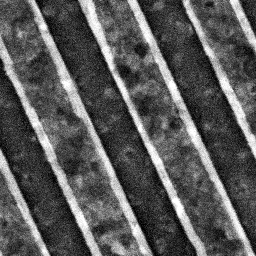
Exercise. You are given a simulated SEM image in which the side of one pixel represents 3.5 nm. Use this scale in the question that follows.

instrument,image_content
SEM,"one or a few lines or trenches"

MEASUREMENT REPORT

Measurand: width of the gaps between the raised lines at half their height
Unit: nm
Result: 156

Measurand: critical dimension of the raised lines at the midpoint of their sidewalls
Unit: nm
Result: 168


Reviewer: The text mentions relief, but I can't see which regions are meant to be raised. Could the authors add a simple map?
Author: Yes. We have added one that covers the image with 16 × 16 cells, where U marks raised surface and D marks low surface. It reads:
UUDDDUUUUDDDUUUD
UUUDDDUUUDDDUUUD
UUUDDDUUUUDDDUUU
UUUUDDDUUUDDDUUU
DUUUDDDUUUDDDDUU
DUUUDDDDUUUDDDUU
DDUUUDDDUUUDDDDU
DDUUUDDDDUUUDDDU
DDDUUUDDDUUUDDDD
DDDUUUDDDDUUUDDD
DDDUUUUDDDUUUDDD
UDDDUUUDDDUUUUDD
UDDDUUUUDDDUUUDD
UUDDDUUUDDDUUUUD
UUDDDUUUUDDDUUUD
UUUDDDUUUDDDUUUD